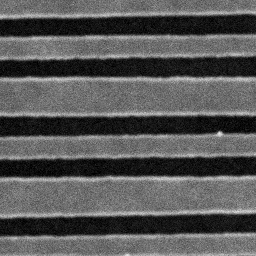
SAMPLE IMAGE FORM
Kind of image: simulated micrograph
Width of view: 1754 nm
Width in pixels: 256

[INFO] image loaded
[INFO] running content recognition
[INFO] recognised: lines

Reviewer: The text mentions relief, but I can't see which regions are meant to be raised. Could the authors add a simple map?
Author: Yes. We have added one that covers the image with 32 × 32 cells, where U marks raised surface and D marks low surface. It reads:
UUUUUUUUUUUUUUUUUUUUUUUUUUUUUUUU
UUUUUUUUUUUUUUUUUUUUUUUUUUUUUUUU
DDDDDDDDDDDDDDDDDDDDDDDDDDDDDDDD
DDDDDDDDDDDDDDDDDDDDDDDDDDDDDDDD
DDDDDDDDDDDDDDDDDDDDUUDDDUUUUUUU
UUUUUUUUUUUUUUUUUUUUUUUUUUUUUUUU
UUUUUUUUUUUUUUUUUUUUUUUUUUUUUUUU
DDDDDDDDDDDDDDDDDDDDDDDDDDDDDDDD
DDDDDDDDDDDDDDDDDDDDDDDDDDDDDDDD
DDDDDDDDDDDDDDDDDDDDDDDDDDDDDDDD
UUUUUUUUUUUUUUUUUUUUUUUUUUUUUUUU
UUUUUUUUUUUUUUUUUUUUUUUUUUUUUUUU
UUUUUUUUUUUUUUUUUUUUUUUUUUUUUUUU
UUUUUUUUUUUUUUUUUUUUUUUUUUUUUUUU
DDDDDDDDDDDDDDDDDDDDDDDDDDDDDDDD
DDDDDDDDDDDDDDDDDDDDDDDDDDDDDDDD
DDDDDDDDDDDDDDDDDDDDDDDDDDDDDDDD
UUUUUUUUUUUUUUUUUUUUUUUUUUUUUUUU
UUUUUUUUUUUUUUUUUUUUUUUUUUUUUUUU
UUUUUUUUUUUUUUUUUUUUUUUUUUUDDDDD
DDDDDDDDDDDDDDDDDDDDDDDDDDDDDDDD
DDDDDDDDDDDDDDDDDDDDDDDDDDDDDDDD
UUUUUUUUUUUUUUUUUUUUUUUUUUUUUUUU
UUUUUUUUUUUUUUUUUUUUUUUUUUUUUUUU
UUUUUUUUUUUUUUUUUUUUUUUUUUUUUUUU
UUUUUUUUUUUUUUUUUUUUUUUUUUUUUUUU
UUUUUUUUUUUUUUUUUUUUUUUUUUUUUUUU
DDDDDDDDDDDDDDDDDDDDDDDDDDDDDDDD
DDDDDDDDDDDDDDDDDDDDDDDDDDDDDDDD
DDDDDDDDDDDDDUUUUUUUUUUUUUUUUUUU
UUUUUUUUUUUUUUUUUUUUUUUUUUUUUUUU
UUUUUUUUUUUUUUUUUUUUUUUUUUUUUUUU